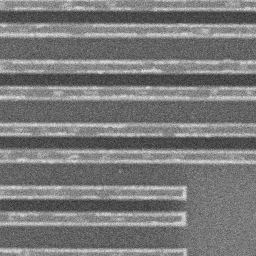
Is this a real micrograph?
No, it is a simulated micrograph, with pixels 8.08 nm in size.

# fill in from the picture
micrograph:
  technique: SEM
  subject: parallel lines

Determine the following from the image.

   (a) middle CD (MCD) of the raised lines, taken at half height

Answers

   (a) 94.9 nm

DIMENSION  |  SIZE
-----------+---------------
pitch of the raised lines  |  31.4 pixels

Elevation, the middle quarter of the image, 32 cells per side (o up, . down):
oooooooooooooooooooooooooooooooo
oooooooooooooooooooooooooooooooo
................................
................................
................................
................................
oooooooooooooooooooooooooooooooo
oooooooooooooooooooooooooooooooo
oooooooooooooooooooooooooooooooo
................................
................................
................................
................................
................................
................................
oooooooooooooooooooooooooooooooo
oooooooooooooooooooooooooooooooo
oooooooooooooooooooooooooooooooo
................................
................................
................................
................................
oooooooooooooooooooooooooooooooo
oooooooooooooooooooooooooooooooo
.oo.............................
................................
................................
................................
................................
................................
................................
oooooooooooooooooooooooooooooo..